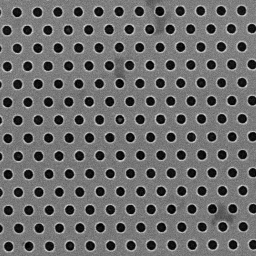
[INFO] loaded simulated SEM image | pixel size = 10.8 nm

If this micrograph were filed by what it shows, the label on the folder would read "a regular array of holes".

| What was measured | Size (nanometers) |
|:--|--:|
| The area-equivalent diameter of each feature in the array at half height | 103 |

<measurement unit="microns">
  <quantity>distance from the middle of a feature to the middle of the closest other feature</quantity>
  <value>0.22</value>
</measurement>